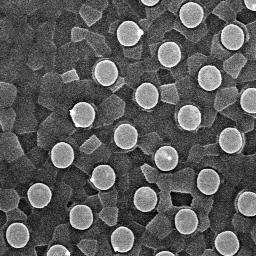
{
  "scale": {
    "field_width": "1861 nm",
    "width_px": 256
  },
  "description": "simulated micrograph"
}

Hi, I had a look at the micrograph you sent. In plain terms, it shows a regular array of raised bodies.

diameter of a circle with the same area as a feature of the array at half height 0.175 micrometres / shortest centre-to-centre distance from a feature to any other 329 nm